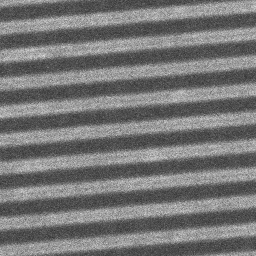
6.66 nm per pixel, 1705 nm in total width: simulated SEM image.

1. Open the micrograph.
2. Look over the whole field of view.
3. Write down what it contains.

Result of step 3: parallel lines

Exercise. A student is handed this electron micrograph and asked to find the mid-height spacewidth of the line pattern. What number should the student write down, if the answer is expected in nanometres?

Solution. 97.1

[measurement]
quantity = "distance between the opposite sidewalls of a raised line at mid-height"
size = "12.8 px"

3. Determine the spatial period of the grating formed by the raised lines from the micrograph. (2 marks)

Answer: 186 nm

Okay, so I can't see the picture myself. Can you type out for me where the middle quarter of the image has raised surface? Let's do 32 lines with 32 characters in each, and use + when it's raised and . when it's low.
.................+++++++++++++++
......++++++++++++++++++++++++++
+++++++++++++++++++++++++++++++.
++++++++++++++++++++............
+++++++++.......................
................................
.............................+++
..................++++++++++++++
.......+++++++++++++++++++++++++
++++++++++++++++++++++++++++++..
++++++++++++++++++..............
+++++++.........................
................................
..............................++
...................+++++++++++++
........++++++++++++++++++++++++
+++++++++++++++++++++++++++++++.
+++++++++++++++++++.............
++++++++........................
................................
.............................+++
..................++++++++++++++
......++++++++++++++++++++++++++
+++++++++++++++++++++++++++++...
++++++++++++++++++..............
+++++++.........................
................................
..............................++
...................+++++++++++++
.......+++++++++++++++++++++++++
++++++++++++++++++++++++++++++..
+++++++++++++++++++.............